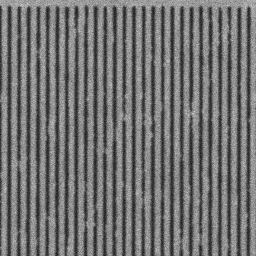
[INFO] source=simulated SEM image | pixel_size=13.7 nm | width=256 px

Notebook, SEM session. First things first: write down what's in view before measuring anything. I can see parallel lines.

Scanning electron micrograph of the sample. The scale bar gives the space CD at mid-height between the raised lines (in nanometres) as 49.5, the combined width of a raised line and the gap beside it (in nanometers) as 131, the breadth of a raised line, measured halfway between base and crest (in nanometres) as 87.1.